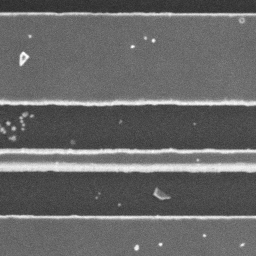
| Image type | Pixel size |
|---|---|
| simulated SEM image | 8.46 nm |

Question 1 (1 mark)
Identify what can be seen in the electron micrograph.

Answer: lines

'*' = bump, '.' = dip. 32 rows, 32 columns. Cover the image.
................................
................................
********************************
********************************
********************************
********************************
********************************
********************************
********************************
********************************
********************************
********************************
********************************
................................
................................
................................
................................
................................
................................
********************************
********************************
................................
................................
................................
................................
................................
................................
********************************
********************************
********************************
********************************
********************************